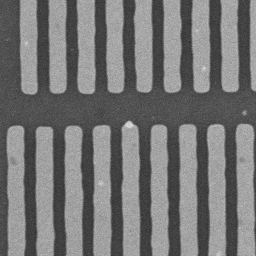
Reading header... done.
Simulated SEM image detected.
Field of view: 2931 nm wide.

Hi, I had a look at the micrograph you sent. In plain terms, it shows groups of lines, slits or small figures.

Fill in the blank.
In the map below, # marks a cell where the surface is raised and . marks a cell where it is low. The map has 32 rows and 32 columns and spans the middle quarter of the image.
#...####...####...####...####...
#...####...####...####...####...
#...####...####...####...####...
#..#####...####...####...####...
#..#####...####...####...####...
#...###....####...####...####...
....###....####....###....###...
................................
................................
................................
................................
................................
................................
................................
................#...............
.........##....###....###....###
.###...#####..####....####...###
####...#####...####...####...###
####....###....####...####...###
.###....###...#####...####...###
.###....###...#####...####...###
.###....####...####...####...###
.###....####...####...####...###
####....####...####...####...###
####....###....####...####...###
####....###....####...####...###
.###....###....####...####...###
####....###....####...####...###
####....###....####...####...###
####....####...####...####...###
.###....####..#####...####...###
.####...####..#####...####...###